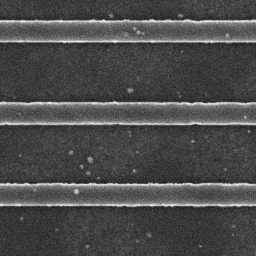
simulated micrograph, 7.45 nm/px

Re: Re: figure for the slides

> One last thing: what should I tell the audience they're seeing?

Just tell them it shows lines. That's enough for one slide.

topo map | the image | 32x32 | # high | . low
................................
................................
................................
################################
################################
................................
................................
................................
................................
................................
................................
................................
................................
################################
################################
##############.#################
................................
................................
................................
................................
................................
................................
................................
################################
################################
################################
................................
................................
................................
................................
................................
................................